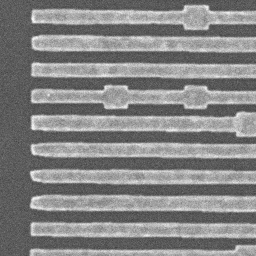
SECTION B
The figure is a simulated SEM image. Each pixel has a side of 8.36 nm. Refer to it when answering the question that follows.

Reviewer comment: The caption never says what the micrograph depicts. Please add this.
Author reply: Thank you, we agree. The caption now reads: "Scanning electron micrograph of wiring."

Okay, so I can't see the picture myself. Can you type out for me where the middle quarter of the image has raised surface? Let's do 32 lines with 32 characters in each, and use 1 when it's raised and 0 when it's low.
11111111111111111111111111111111
11111111111111111111111111111111
11111111111111111111111111111111
00000000000000000000000000000000
00000000000000000000000000000000
00000000000000000000000000000000
00000000001111110000000000000011
11111111111111111111111111111111
11111111111111111111111111111111
11111111111111111111111111111111
00000000001111110000000000000011
00000000000000000000000000000000
00000000000000000000000000000000
11111111111111111111111111111111
11111111111111111111111111111111
11111111111111111111111111111111
00000011111111111111111111111111
00000000000000000000000000000000
00000000000000000000000000000000
00000000000000000000000000000000
11111111111111111111111111111111
11111111111111111111111111111111
11111111111111111111111111111111
00000000000000000000000000000000
00000000000000000000000000000000
00000000000000000000000000000000
00000000000000000000000000000000
11111111111111111111111111111111
11111111111111111111111111111111
11111111111111111111111111111111
00000000000000000000000000000000
00000000000000000000000000000000